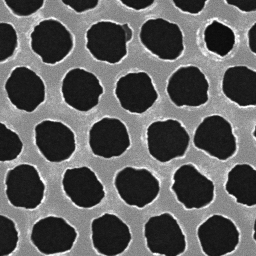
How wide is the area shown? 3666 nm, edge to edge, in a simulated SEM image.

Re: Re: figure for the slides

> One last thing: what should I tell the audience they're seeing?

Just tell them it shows a regular array of holes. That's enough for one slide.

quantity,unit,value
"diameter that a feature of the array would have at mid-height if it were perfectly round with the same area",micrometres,0.588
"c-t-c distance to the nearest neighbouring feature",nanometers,775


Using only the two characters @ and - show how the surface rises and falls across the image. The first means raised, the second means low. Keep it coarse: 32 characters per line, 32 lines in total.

@----@@@----@@@@---@@@----@@@---
@@--@@@@@@@@@@@@@@@@@@@--@@@@@@@
@@@@@@-@@@@@@@@@@@@--@@@@@@@@@@@
--@@----@@@-----@@----@@@@---@@-
--@@-----@@-----@@-----@@@---@@-
--@@-----@@-----@@-----@@@---@@-
--@@-----@@-----@@@----@@@@--@@@
@@@@@---@@@@---@@@@@@@@@@@@@@@@@
@@-@@@@@@@@@@@@@@@@@@@@--@@@@--@
@----@@@----@@@----@@-----@@----
@----@@@-----@@----@@-----@@----
@-----@@-----@------@-----@@----
@----@@@----@@@----@@-----@@@---
@@--@@@@@--@@@@----@@@@@@@@@@@@@
@@@@@@@@@@@@@@@@@@@@@@@@@@-@@@@@
@@@@@---@@@@---@@@@----@@----@@@
--@@-----@@-----@@-----@-----@@@
---@-----@@-----@@-----------@@@
---@@----@@-----@@-----@@----@@@
--@@@@---@@@---@@@@---@@@@@--@@@
@@@@@@@@@@@@@@@@@@@@@@@@@@@@@@@@
@----@@@----@@@----@@@---@@@@---
@----@@@----@@------@@----@@----
@-----@@-----@@-----@@-----@----
@----@@@@----@@-----@@-----@@---
@----@@@@---@@@@--@@@@@---@@@@--
@@@@@@@@@@@@@@@@@@@@@@@@@@@@@@@@
-@@@@---@@@@---@@@@---@@@@---@@@
--@@-----@@-----@@-----@@-----@@
--@@------@-----@@-----@@-----@@
--@@-----@@@----@@-----@@-----@@
-@@@@---@@@@---@@@@----@@@---@@@